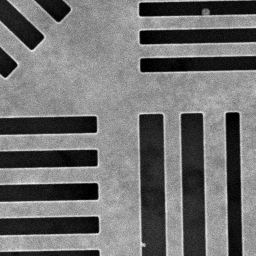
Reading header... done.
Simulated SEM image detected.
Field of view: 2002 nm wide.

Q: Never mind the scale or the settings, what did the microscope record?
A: groups of lines, slits or small figures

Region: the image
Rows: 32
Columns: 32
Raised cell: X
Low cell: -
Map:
-XXXX---XXXXXXXXXX--------------
--XXXX---XXXXXXXX---------------
---XXXX-XXXXXXXXXXXXXXXXXXXXXXXX
X----XXXXXXXXXXXXXXXXXXXXXXXXX--
XX---XXXXXXXXXXXX---------------
XXX--XXXXXXXXXXXXX-------XXXXXXX
-XXXXXXXXXXXXXXXXXXXXXXXXXXXXXXX
--XXXXXXXXXXXXXXXX--------------
--XXXXXXXXXXXXXXXX--------------
-XXXXXXXXXXXXXXXXXXXXXXXXXXXXXXX
XXXXXXXXXXXXXXXXXXXXXXXXXXXXXXXX
XXXXXXXXXXXXXXXXXXXXXXXXXXXXXXXX
XXXXXXXXXXXXXXXXXXXXXXXXXXXXXXXX
XXXXXXXXXXXXXXXXXXXXXXXXXXXXXXXX
XXXXXXXX----XXXXXX--XXX--XXX--XX
------------XXXXX----XX---XX--XX
------------XXXXX----XX---XX--XX
XXXXXXXXXXXXXXXXX----XX---XX--XX
XXXXXXXXXXXXXXXXX----XX---XX--XX
------------XXXXX----XX---XX--XX
------------XXXXX----XX---XX--XX
XXXXXXXXXXXXXXXXX----XX---XX--XX
XXXXXXXXXXXXXXXXX----XX---XX--XX
------------XXXXX----XX---XX--XX
------------XXXXXX---XX---XX--XX
XXXXXXXXXXXXXXXXXX---XX---XX--XX
XXXXXXXXXXXXXXXXXX---XX---XX--XX
------------XXXXXX---XX---XX--XX
------------XXXXXX---XX---XX--XX
XXXXXXXXXXXXXXXXXX---XX---XX--XX
XXXXXXXXXXXXXXXXXX---XX---XX--XX
------------XXXXXX---XX---XX--XX